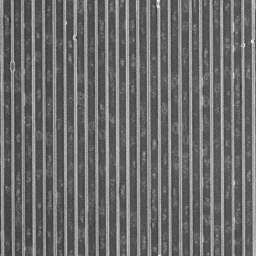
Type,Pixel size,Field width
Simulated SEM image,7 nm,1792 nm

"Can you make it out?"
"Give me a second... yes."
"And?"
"parallel lines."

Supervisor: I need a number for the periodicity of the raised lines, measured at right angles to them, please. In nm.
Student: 73.4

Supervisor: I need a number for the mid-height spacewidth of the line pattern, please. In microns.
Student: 0.0595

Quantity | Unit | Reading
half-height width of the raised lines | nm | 17.5